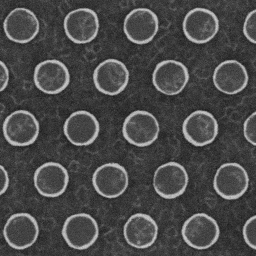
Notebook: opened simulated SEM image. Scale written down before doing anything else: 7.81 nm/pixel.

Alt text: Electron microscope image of a regular array of raised bodies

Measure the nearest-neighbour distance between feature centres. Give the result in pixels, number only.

59.1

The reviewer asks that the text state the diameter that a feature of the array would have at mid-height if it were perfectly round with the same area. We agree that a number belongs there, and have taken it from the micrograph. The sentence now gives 33.2 px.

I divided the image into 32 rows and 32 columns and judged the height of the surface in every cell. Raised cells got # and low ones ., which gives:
................................
..##.....##......##.....##......
.####...####....####...####....#
.####...####....####...####....#
.###.....###....###....####....#
................................
................................
................................
#....###....####....###....###..
#...####....####...####....####.
#....###....####...####....####.
......#......##.....##......##..
................................
................................
.###.....##.....###.....##.....#
.####...####....####...####....#
.####...####....####...####....#
.###.....##.....###.....##.....#
................................
................................
......#..............#..........
#....###....####....###....####.
#...####....####...####....####.
#....###....####...####....####.
......#......#.......#......##..
................................
................................
.###.....###....###.....##.....#
.####...####....###....####....#
.####...####....###....####....#
.###.....##.....###.....##.....#
................................